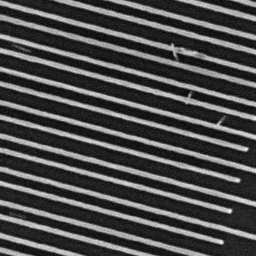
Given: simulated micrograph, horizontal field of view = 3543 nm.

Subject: parallel lines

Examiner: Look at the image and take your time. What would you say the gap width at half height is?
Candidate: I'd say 0.152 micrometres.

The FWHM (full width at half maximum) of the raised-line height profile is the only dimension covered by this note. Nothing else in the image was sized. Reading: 0.0585 micrometres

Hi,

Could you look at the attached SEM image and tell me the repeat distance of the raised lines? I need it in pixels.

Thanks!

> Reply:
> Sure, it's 16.